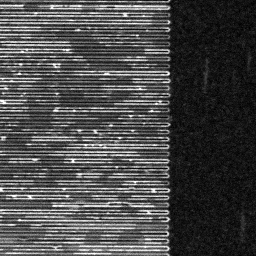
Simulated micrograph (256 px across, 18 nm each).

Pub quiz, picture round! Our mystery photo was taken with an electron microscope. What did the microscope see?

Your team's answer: parallel lines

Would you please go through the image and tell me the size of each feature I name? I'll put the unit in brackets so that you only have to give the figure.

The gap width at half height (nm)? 33.8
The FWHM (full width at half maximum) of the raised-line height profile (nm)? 99.1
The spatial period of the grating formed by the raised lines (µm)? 0.132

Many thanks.